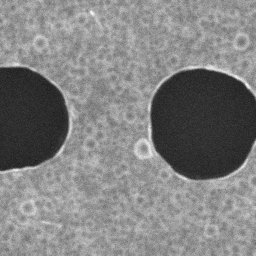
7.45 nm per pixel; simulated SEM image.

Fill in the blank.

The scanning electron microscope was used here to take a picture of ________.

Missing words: holes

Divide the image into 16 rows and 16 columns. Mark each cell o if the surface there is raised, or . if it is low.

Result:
oooooooooooooooo
oooooooooooooooo
oooooooooooooooo
oooooooooooooooo
..ooooooooo...oo
....oooooo......
....ooooo.......
....ooooo.......
....ooooo.......
....oooooo......
.oooooooooo....o
oooooooooooooooo
oooooooooooooooo
oooooooooooooooo
oooooooooooooooo
oooooooooooooooo